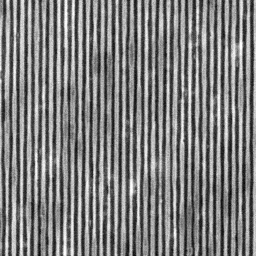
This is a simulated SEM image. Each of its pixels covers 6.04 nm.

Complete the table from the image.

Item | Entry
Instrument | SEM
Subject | parallel lines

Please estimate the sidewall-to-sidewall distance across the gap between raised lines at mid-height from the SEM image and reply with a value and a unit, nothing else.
27.9 nm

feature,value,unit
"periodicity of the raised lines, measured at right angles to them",44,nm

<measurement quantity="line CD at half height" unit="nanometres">17.4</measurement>